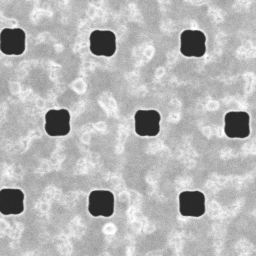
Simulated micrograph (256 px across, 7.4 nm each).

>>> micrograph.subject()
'holes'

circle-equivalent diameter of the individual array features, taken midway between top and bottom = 209 nm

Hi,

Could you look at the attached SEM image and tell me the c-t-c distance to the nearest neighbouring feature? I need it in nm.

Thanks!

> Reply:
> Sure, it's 665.